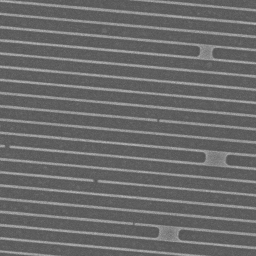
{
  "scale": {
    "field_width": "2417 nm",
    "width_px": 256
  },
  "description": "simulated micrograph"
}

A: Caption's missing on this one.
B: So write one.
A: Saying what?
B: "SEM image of parallel lines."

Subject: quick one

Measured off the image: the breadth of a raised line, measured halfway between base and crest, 16.4 nm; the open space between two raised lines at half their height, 102 nanometres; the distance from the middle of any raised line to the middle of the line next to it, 13.1 pixels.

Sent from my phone